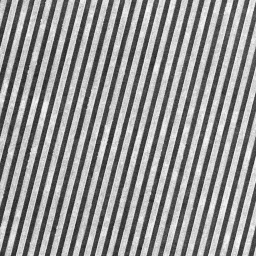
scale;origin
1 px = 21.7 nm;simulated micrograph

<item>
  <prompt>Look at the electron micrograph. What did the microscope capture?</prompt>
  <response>parallel lines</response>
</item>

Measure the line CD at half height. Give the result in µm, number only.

0.116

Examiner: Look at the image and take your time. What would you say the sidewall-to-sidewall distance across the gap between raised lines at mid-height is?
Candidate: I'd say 118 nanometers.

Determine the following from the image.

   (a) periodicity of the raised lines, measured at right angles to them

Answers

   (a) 11 px